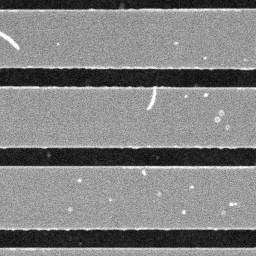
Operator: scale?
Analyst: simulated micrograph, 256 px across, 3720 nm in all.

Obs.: lines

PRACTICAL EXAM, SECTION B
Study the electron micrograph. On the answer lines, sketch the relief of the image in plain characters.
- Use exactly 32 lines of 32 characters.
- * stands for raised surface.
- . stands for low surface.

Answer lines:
................................
********************************
********************************
********************************
********************************
********************************
********************************
********************************
...*.***************************
................................
................................
********************************
********************************
********************************
********************************
********************************
********************************
********************************
*....*.*....*..***....*..*****.*
................................
................................
********************************
********************************
********************************
********************************
********************************
********************************
********************************
********************************
................................
................................
********************************